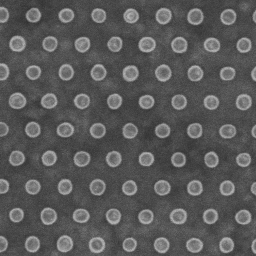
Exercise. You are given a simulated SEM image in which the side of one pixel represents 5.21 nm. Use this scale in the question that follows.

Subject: a regular array of raised bodies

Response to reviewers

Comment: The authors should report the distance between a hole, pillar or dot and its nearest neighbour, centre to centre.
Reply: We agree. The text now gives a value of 168 nm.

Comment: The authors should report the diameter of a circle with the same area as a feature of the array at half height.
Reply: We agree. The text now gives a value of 72.3 nanometres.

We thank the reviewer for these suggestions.